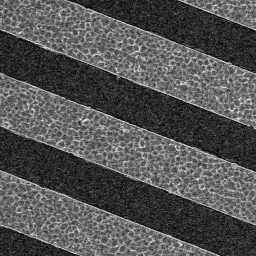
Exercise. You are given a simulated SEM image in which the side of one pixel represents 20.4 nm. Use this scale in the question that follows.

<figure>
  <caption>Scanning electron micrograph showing one or a few lines or trenches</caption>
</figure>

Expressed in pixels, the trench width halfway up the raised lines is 41.1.